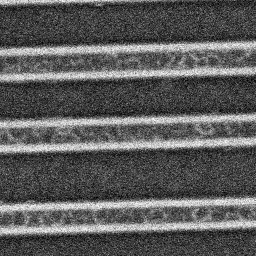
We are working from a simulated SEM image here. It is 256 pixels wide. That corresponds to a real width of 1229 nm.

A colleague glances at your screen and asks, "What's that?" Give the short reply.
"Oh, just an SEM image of one or a few lines or trenches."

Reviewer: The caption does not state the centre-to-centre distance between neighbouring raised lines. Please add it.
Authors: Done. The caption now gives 0.372 microns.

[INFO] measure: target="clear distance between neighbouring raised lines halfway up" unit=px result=51.6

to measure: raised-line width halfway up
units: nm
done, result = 117